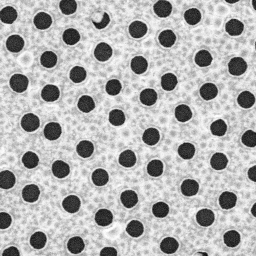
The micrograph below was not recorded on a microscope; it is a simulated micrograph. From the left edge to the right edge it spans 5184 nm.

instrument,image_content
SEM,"a regular array of holes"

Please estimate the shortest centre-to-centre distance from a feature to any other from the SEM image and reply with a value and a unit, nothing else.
648 nanometers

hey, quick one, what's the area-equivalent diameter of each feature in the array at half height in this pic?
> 371 nanometres